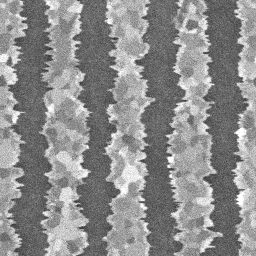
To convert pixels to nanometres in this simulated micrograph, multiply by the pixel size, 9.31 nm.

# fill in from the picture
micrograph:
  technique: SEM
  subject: one or a few lines or trenches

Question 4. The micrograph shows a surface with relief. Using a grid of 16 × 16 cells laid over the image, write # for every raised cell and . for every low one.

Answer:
#..##..##..##..#
#..##..##..##..#
#..##..##..##..#
#..##..##..##..#
#..##..##..##..#
#..##..##..##..#
#..##..##..##..#
#..##..##..##..#
#..##..##..##..#
#..##..##..##..#
#..##..##..##..#
#..##..##..##..#
#..##..##..##..#
#..##..##..##..#
#..##..##..##..#
#..##..##..##..#